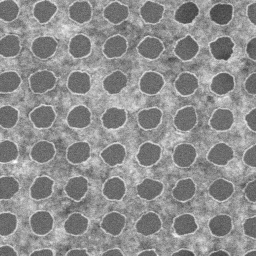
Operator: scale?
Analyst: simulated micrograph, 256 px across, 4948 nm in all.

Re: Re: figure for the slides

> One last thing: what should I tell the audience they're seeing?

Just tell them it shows a regular array of raised bodies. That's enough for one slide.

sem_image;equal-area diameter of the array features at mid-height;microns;0.475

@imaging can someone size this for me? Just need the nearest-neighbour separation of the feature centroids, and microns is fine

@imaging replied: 0.674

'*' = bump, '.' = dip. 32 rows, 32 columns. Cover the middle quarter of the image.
................................
................................
..****......***.....****.....***
.******...******...******...****
.******...******...******...****
.******...******...******...****
.*****....*****....*****....****
...........**........**......***
................................
................................
...**...........................
..****....*****....*****.....***
.******...******..*******...****
.******..*******..******...*****
.******...*****....*****...*****
.*****....*****....****.....****
.............................***
................................
................................
...***..........................
.*****.....****....*****....****
.******...*****....*****....****
.******..******...******...*****
.*****...******...******...*****
.****.....*****....****....*****
...........**.......**......****
................................
................................
.****.......**..................
.*****....*****....*****....****
******....*****...*******...****
******....*****...*******..*****